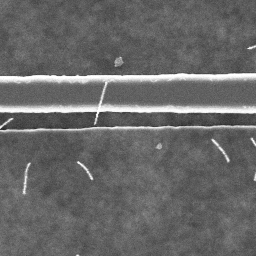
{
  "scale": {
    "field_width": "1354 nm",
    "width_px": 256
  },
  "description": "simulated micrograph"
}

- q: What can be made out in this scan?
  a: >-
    lines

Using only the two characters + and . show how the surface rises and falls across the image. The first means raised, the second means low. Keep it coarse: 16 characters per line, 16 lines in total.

................
................
................
................
................
++++++++++++++++
++++++++++++++++
................
................
................
................
................
................
................
................
................